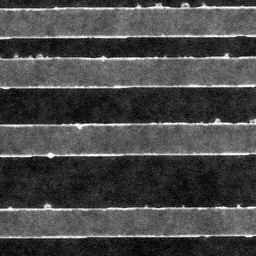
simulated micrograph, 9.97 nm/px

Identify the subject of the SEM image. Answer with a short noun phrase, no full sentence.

lines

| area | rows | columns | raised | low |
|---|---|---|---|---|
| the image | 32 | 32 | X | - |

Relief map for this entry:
--------------------------------
XXXXXXXXXXXXXXXXXXXXXXXXXXXXXXXX
XXXXXXXXXXXXXXXXXXXXXXXXXXXXXXXX
XXXXXXXXXXXXXXXXXXXXXXXXXXXXXXXX
XXXXXXXXXXXXXXXXXXXXXXXXXXXXXX-X
--------------------------------
--------------------------------
XXXXXXXXXXXXXXXXXXXXXXXXXXXXXXXX
XXXXXXXXXXXXXXXXXXXXXXXXXXXXXXXX
XXXXXXXXXXXXXXXXXXXXXXXXXXXXXXXX
XXXXXXXXXXXXXXXXXXXXXXXXXXXXXXXX
--------------------------------
--------------------------------
--------------------------------
--------------------------------
------------------XXXXXX--XXXXXX
XXXXXXXXXXXXXXXXXXXXXXXXXXXXXXXX
XXXXXXXXXXXXXXXXXXXXXXXXXXXXXXXX
XXXXXXXXXXXXXXXXXXXXXXXXXXXXXXXX
XXXX--X-------------------------
--------------------------------
--------------------------------
--------------------------------
--------------------------------
--------------------------------
--------------------------------
XXXXXXXXXXXXXXXXXXXXXXXXXXXXXXXX
XXXXXXXXXXXXXXXXXXXXXXXXXXXXXXXX
XXXXXXXXXXXXXXXXXXXXXXXXXXXXXXXX
XXXXXXXXXXXXXXXXXXXXXXXXXX------
--------------------------------
--------------------------------